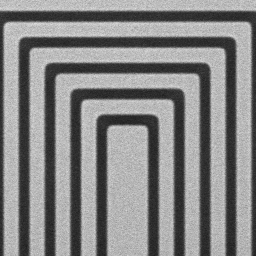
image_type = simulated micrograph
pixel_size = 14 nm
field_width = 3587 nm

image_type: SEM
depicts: groups of lines, slits or small figures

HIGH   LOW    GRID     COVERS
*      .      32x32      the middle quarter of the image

................................
................................
................................
********************************
********************************
********************************
**...........................***
**............................**
*.............................**
*....**********************...**
*...***********************...**
*...***********************...**
*...******............*****...**
*...****...............****...**
*...****................***...**
*...****....********....***...**
*...****...**********...***...**
*...****...**********...***...**
*...****...**********...***...**
*...****...**********...***...**
*...****...**********...***...**
*...****...**********...***...**
*...****...**********...***...**
*...****...**********...***...**
*...****...**********...***...**
*...****...**********...***...**
*...****...**********...***...**
*...****...**********...***...**
*...****...**********...***...**
*...****...**********...***...**
*...****...**********...***...**
*...****...**********...***...**